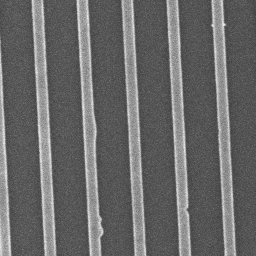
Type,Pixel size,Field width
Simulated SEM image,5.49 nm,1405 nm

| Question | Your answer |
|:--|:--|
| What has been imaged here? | parallel lines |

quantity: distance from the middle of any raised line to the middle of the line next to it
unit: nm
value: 246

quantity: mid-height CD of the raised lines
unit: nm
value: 58.9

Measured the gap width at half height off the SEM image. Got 0.187 um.